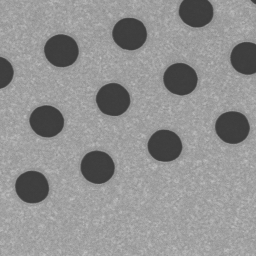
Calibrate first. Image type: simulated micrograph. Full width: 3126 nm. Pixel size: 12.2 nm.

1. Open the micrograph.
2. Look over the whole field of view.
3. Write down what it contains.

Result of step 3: a regular array of holes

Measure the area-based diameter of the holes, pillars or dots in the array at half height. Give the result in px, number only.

33.5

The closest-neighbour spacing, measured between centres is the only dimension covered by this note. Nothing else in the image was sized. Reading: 829 nm